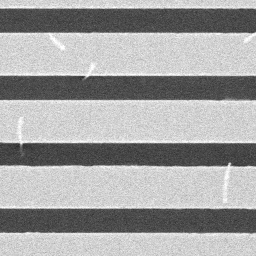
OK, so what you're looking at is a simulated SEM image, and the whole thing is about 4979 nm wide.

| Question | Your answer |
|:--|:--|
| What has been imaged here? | lines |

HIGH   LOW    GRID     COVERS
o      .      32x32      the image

oooooooooooooooooooooooooooooooo
................................
................................
................................
oooooooooooooooooooooooooooooooo
oooooooooooooooooooooooooooooooo
oooooooooooooooooooooooooooooooo
oooooooooooooooooooooooooooooooo
oooooooooooooooooooooooooooooooo
..........o.....................
................................
................................
................................
oooooooooooooooooooooooooooooooo
oooooooooooooooooooooooooooooooo
oooooooooooooooooooooooooooooooo
oooooooooooooooooooooooooooooooo
oooooooooooooooooooooooooooooooo
................................
................................
................................
oooooooooooooooooooooooooooooooo
oooooooooooooooooooooooooooooooo
oooooooooooooooooooooooooooooooo
oooooooooooooooooooooooooooooooo
oooooooooooooooooooooooooooooooo
................................
................................
................................
oooooooooooooooooooooooooooooooo
oooooooooooooooooooooooooooooooo
oooooooooooooooooooooooooooooooo